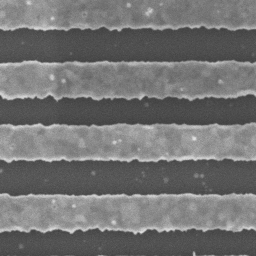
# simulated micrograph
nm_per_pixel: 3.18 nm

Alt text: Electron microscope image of lines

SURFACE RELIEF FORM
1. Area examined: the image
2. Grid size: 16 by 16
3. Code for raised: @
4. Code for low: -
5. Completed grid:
@@@@@@@@@@@@@@@@
@@@@@@@@@@@@@@@@
----------------
----------------
@@@@@@@@@@@@@@@@
@@@@@@@@@@@@@@@@
----------------
----------------
@@@@@@@@@@@@@@@@
@@@@@@@@@@@@@@@@
----------------
----------------
@@@@@@@@@@@@@@@@
@@@@@@@@@@@@@@@@
--------@-------
----------------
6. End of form